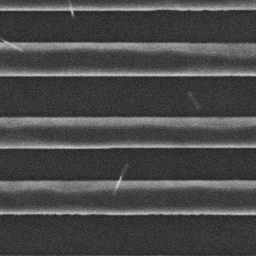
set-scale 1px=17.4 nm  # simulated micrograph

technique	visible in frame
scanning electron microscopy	lines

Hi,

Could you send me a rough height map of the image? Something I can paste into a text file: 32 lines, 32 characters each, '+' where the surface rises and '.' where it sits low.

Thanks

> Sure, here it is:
++++++++++++++++++++++++++++++++
................................
................................
................................
................................
................................
++++++++++++++++++++++++++++++++
++++++++++++++++++++++++++++++++
++++++++++++++++++++++++++++++++
................................
................................
................................
................................
................................
................................
++++++++++++++++++++++++++++++++
++++++++++++++++++++++++++++++++
++++++++++++++++++++++++++++++++
................................
................................
................................
................................
................................
++++++++++++++++++++++++++++++++
++++++++++++++++++++++++++++++++
++++++++++++++++++++++++++++++++
++++++++++++++++++++++++++++++++
................................
................................
................................
................................
................................